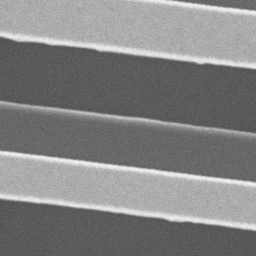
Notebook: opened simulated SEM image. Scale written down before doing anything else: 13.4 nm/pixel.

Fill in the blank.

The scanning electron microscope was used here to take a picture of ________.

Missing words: lines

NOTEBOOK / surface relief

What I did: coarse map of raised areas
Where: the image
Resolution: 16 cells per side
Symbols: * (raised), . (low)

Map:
****************
****************
.***************
..........******
................
................
*...............
*********.......
****************
****************
****************
****************
.***************
.........*******
................
................